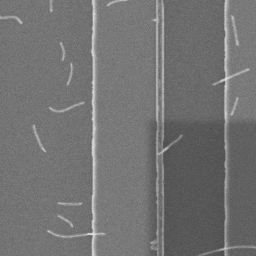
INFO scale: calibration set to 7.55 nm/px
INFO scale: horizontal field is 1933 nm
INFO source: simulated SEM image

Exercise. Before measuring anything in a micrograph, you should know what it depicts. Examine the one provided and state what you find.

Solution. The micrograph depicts lines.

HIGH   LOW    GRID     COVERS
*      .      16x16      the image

......****....**
......****....**
......****....**
......****....**
......****....**
......****....**
......****....**
......****....**
......****....**
......****....**
......****....**
......****....**
......****....**
......****....**
......****....**
......****....**